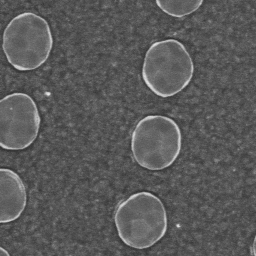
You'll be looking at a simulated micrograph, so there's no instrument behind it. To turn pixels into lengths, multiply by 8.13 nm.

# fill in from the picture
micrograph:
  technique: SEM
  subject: raised bodies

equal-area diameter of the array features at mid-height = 52.2 px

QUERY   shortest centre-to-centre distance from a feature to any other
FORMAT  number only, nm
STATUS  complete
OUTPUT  631